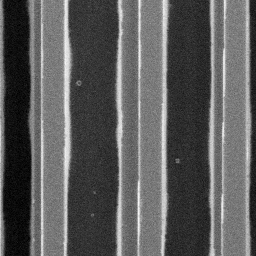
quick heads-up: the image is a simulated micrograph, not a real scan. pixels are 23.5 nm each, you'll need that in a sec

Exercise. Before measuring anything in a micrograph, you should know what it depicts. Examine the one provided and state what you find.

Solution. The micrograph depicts lines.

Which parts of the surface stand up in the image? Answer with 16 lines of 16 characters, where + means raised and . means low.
..++....++...++.
..++....++...++.
..++....++...++.
..++....++...++.
..++....++...++.
..++....++...++.
..++....++...++.
..++....++...++.
..++....++...++.
..++....++...++.
..++....++...++.
..++....++...++.
..++....++...++.
..++....++...++.
..++....++...++.
..++....++...++.